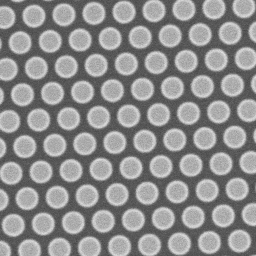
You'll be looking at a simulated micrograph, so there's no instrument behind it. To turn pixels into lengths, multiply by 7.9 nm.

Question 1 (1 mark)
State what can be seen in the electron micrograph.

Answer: an array of small figures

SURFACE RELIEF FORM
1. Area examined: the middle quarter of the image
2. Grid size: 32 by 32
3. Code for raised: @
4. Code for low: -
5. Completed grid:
@@@--@@@@@@--@@@@@--@@@@@@--@@@@
@@@---@@@@---@@@@@---@@@@----@@@
@@@---@@@@-----@@---------------
--------------------------@@----
---@@@-----@@@----@@@@---@@@@---
--@@@@@---@@@@@--@@@@@--@@@@@@--
--@@@@@--@@@@@@--@@@@@--@@@@@@--
--@@@@@---@@@@@--@@@@@---@@@@---
--@@@@@---@@@@----@@@-----@@----
----@@--------------------------
---------------@@-----@@@----@@@
@@@----@@@@---@@@@---@@@@@---@@@
@@@@--@@@@@---@@@@@--@@@@@--@@@@
@@@@--@@@@@---@@@@@--@@@@@---@@@
@@@@--@@@@@---@@@@----@@@@----@@
@@@----@@@------@---------------
---------------------------@@---
----@@-----@@@----@@@@---@@@@@--
---@@@@---@@@@@---@@@@@--@@@@@--
---@@@@@--@@@@@---@@@@@--@@@@@--
---@@@@@--@@@@@---@@@@----@@@@--
---@@@@----@@@@----@@@-----@----
----@@--------------------------
----------------@@-----@@@----@@
@@@----@@@@----@@@@---@@@@@--@@@
@@@@---@@@@@--@@@@@---@@@@@--@@@
@@@@---@@@@@--@@@@@---@@@@@--@@@
@@@@---@@@@@--@@@@@---@@@@----@@
@@@@----@@@-----@@--------------
---------------------------@@---
-----@@-----@@@----@@@@---@@@@@-
----@@@@---@@@@@--@@@@@---@@@@@-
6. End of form